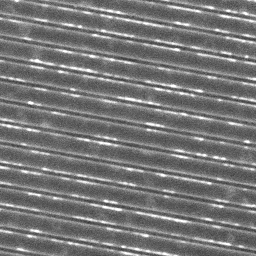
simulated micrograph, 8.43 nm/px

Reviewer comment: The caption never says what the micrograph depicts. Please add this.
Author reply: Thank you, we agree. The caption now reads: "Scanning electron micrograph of parallel lines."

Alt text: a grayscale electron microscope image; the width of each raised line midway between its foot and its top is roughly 16.4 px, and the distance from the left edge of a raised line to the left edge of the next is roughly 176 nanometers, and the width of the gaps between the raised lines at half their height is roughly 0.0373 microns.